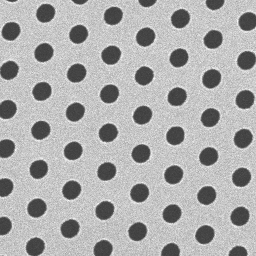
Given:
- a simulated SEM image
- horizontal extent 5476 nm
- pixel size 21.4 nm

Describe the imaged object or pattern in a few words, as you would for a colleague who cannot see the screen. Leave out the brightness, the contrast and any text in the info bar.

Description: a regular array of holes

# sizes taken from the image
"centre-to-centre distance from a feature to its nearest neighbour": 827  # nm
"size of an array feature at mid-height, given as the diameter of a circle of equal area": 0.419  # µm